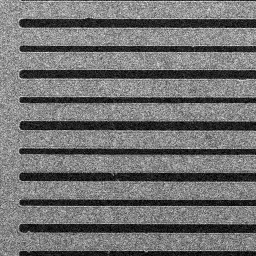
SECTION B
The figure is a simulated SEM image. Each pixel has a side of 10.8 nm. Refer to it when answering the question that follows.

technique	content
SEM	parallel lines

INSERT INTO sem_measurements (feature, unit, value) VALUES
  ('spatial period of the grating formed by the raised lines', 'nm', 280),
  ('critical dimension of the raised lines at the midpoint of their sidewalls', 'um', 0.186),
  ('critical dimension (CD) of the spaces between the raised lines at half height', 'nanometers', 99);